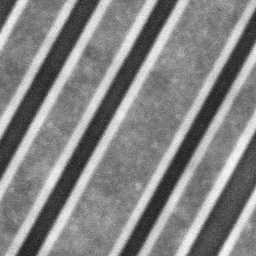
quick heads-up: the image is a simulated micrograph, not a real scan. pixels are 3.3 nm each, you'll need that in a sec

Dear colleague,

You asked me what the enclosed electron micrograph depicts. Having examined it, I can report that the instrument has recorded one or a few lines or trenches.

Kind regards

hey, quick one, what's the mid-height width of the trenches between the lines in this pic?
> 91.2 nm